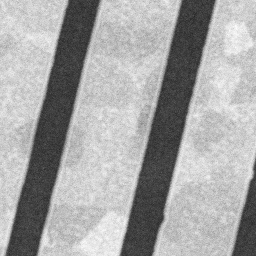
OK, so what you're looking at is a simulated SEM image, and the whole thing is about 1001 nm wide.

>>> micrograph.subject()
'one or a few lines or trenches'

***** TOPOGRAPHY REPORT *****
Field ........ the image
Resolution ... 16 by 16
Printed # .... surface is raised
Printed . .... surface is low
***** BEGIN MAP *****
####..#####..###
####..#####..###
###...#####..###
###...####...###
###..#####..####
###..#####..####
###..#####..####
##...####...####
##..#####...####
##..#####..#####
##..#####..#####
#...####...####.
#..#####...####.
#..#####..#####.
#..#####..#####.
...#####..####..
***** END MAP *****